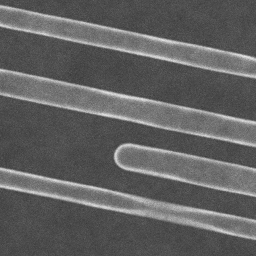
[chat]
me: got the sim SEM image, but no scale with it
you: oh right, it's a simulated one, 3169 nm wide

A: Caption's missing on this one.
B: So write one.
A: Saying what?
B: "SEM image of groups of lines, slits or small figures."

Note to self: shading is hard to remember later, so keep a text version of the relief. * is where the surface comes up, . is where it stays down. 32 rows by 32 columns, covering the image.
................................
****............................
*********.......................
.*************..................
......************..............
...........*************........
................*************...
.....................***********
.........................*******
****...........................*
*********.......................
*************...................
...****************.............
........***************.........
.............***************....
..................**************
.......................*********
............................****
...............***..............
..............**********........
...............**************...
**................**************
*******...............**********
.***********..............******
......**********................
...........*********............
................***********.....
.....................**********.
..........................******
..............................**
................................
................................